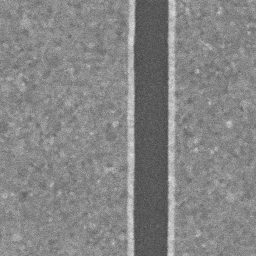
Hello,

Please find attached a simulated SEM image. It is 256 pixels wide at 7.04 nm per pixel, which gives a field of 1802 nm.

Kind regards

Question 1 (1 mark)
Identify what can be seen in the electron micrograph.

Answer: one or a few lines or trenches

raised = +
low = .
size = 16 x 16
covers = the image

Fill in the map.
++++++++...+++++
++++++++...+++++
++++++++...+++++
++++++++...+++++
++++++++...+++++
++++++++...+++++
++++++++...+++++
++++++++...+++++
++++++++...+++++
++++++++...+++++
++++++++...+++++
++++++++...+++++
++++++++...+++++
++++++++...+++++
++++++++...+++++
++++++++...+++++